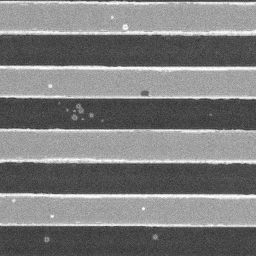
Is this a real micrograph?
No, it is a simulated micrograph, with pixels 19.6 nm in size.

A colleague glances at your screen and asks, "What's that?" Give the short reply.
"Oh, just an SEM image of lines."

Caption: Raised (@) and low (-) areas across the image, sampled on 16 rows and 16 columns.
@@@@@@@@@@@@@@@@
@@@@@@@@@@@@@@@@
----------------
----------------
@@@@@@@@@@@@@@@@
@@@@@@@@@@@@@@@@
----------------
----------------
@@@@@@@@@@@@@@@@
@@@@@@@@@@@@@@@@
----------------
----------------
@@@@@@@@@@@@@@@@
@@@@@@@@@@@@@@@@
----------------
----------------